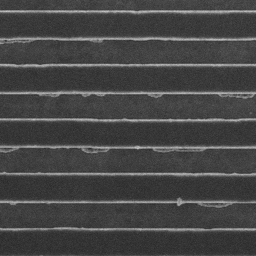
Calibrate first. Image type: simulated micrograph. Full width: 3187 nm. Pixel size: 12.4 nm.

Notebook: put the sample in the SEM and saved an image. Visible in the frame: lines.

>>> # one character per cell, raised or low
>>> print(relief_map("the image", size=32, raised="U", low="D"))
DDDDDDDDDDDDDDDDDDDDDDDDDDDDDDDD
UUUUUUUUUUUUUUUUUUUUUUUUUUUUUUUU
UUUUUUUUUUUUUUUUUUUUUUUUUUUUUUUU
UUUUUUUUUUUUUUUUUUUUUUUUUUUUUUUU
UUUUUUUUUUUUUUUUUUUUUUUUUUUUUUUU
DDDDDDDDDDDDDDDDDDDDDDDDDDDDDDDD
DDDDDDDDDDDDDDDDDDDDDDDDDDDDDDDD
DDDDDDDDDDDDDDDDDDDDDDDDDDDDDDDD
UUUUUUUUUUUUUUUUUUUUUUUUUUUUUUUU
UUUUUUUUUUUUUUUUUUUUUUUUUUUUUUUU
UUUUUUUUUUUUUUUUUUUUUUUUUUUUUUUU
UUUUUUUUUUUUUUUUUUUUUUUUUUUUUUUU
DDDDDDDDDDDDDDDDDDDDDDDDDDDDDDDD
DDDDDDDDDDDDDDDDDDDDDDDDDDDDDDDD
DDDDDDDDDDDDDDDDDDDDDDDDDDDDDDDD
UUUUUUUUUUUUUUUUUUUUUUUUUUUUUUUU
UUUUUUUUUUUUUUUUUUUUUUUUUUUUUUUU
UUUUUUUUUUUUUUUUUUUUUUUUUUUUUUUU
DDDDDDDDDDDUUUUUUUUUUUUUUUUUUUUU
DDDDDDDDDDDDDDDDDDDDDDDDDDDDDDDD
DDDDDDDDDDDDDDDDDDDDDDDDDDDDDDDD
DDDDDDDDDDDDDDDDDDDDDDDDDDDDDDDD
UUUUUUUUUUUUUUUUUUUUUUUUUUUUUUUU
UUUUUUUUUUUUUUUUUUUUUUUUUUUUUUUU
UUUUUUUUUUUUUUUUUUUUUUUUUUUUUUUU
DDDDDDDDDDDDDDDDDDDDDDUDDDDDDDDD
DDDDDDDDDDDDDDDDDDDDDDDDDDDDDDDD
DDDDDDDDDDDDDDDDDDDDDDDDDDDDDDDD
DDDDDDUUUUDDDDDDDDDDDDDDDDDDDDDD
UUUUUUUUUUUUUUUUUUUUUUUUUUUUUUUU
UUUUUUUUUUUUUUUUUUUUUUUUUUUUUUUU
UUUUUUUUUUUUUUUUUUUUUUUUUUUUUUUU